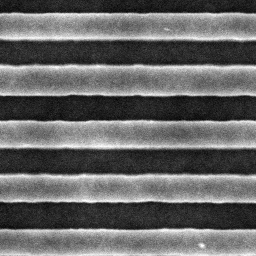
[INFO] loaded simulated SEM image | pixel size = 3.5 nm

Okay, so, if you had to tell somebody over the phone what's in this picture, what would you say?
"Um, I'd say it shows lines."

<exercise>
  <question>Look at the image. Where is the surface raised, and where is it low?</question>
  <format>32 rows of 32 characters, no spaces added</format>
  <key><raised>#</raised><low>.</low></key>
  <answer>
................................
................................
################################
################################
################################
................................
................................
................................
################################
################################
################################
################################
................................
................................
................................
################################
################################
################################
................................
................................
................................
................................
################################
################################
################################
................................
................................
................................
................................
################################
################################
################################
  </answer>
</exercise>